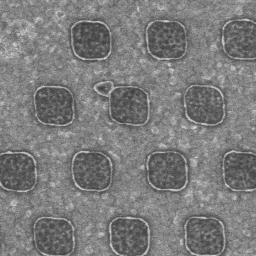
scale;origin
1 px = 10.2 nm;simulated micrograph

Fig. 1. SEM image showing raised bodies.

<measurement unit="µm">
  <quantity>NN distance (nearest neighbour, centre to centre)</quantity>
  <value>0.769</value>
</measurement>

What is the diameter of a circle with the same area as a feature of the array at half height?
427 nm